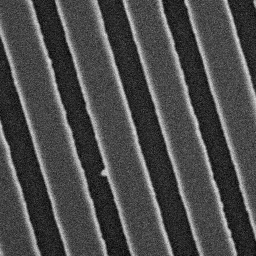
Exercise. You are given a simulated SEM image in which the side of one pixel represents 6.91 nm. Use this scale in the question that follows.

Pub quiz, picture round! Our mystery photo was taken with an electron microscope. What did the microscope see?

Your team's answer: lines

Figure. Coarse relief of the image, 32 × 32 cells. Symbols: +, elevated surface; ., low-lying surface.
++++...+++++...+++++...++++++...
++++...+++++....++++....+++++...
+++++...+++++...+++++...+++++...
+++++...+++++...+++++...+++++...
+++++...+++++....+++++..++++++..
++++++..++++++...+++++...+++++..
.+++++...+++++...+++++...+++++..
.+++++...+++++....++++...++++++.
.++++++..++++++...+++++...+++++.
..+++++...+++++...+++++...+++++.
..+++++...+++++...+++++...+++++.
..+++++...+++++....+++++..++++++
...+++++...+++++...+++++...+++++
...+++++...+++++...+++++...+++++
...+++++...+++++....++++...+++++
...++++++..++++++...+++++...++++
....+++++...+++++...+++++...++++
+...+++++...+++++....++++...++++
+...+++++...++++++...+++++...+++
+....+++++...+++++...+++++...+++
++...+++++...+++++....++++...+++
++...+++++...+++++....+++++...++
++....+++++...+++++...+++++...++
+++...+++++...+++++...+++++...++
+++...+++++...+++++....++++...++
+++...++++++...+++++...+++++...+
+++....+++++...+++++...+++++...+
++++...+++++...+++++....++++...+
++++...+++++...++++++...+++++...
++++....+++++...+++++...+++++...
+++++...+++++...+++++...+++++...
+++++...+++++...++++++...+++++..